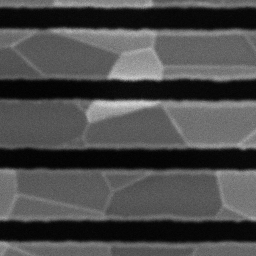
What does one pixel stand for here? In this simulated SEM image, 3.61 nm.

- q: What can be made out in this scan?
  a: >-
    lines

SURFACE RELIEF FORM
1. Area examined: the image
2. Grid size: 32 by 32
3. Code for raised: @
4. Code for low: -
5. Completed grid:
@@@@@@@@@@@@@@@@@@@@@@@@@@@@@@@@
--------------------------------
--------------------------------
--------------------------------
@@@@@@@@@@@@@@@@@@@@@@@@@@@@@@@@
@@@@@@@@@@@@@@@@@@@@@@@@@@@@@@@@
@@@@@@@@@@@@@@@@@@@@@@@@@@@@@@@@
@@@@@@@@@@@@@@@@@@@@@@@@@@@@@@@@
@@@@@@@@@@@@@@@@@@@@@@@@@@@@@@@@
@@@@@@@@@@@@@@@@@@@@@@@@@@@@@@@@
--------------------------------
--------------------------------
@@@--@@@@@@---------------------
@@@@@@@@@@@@@@@@@@@@@@@@@@@@@@@@
@@@@@@@@@@@@@@@@@@@@@@@@@@@@@@@@
@@@@@@@@@@@@@@@@@@@@@@@@@@@@@@@@
@@@@@@@@@@@@@@@@@@@@@@@@@@@@@@@@
@@@@@@@@@@@@@@@@@@@@@@@@@@@@@@@@
@@@-@@@@@@@@@@@@@@@@@@@@@@@@@@@@
--------------------------------
--------------------------------
@@@@@@@@@@@@@@@@@@@@@@@@@@@@@@@@
@@@@@@@@@@@@@@@@@@@@@@@@@@@@@@@@
@@@@@@@@@@@@@@@@@@@@@@@@@@@@@@@@
@@@@@@@@@@@@@@@@@@@@@@@@@@@@@@@@
@@@@@@@@@@@@@@@@@@@@@@@@@@@@@@@@
@@@@@@@@@@@@@@@@@@@@@@@@@@@@@@@@
@-@@@@@--@@@@@@@@@@@-@@@@@@@@@@@
--------------------------------
--------------------------------
@@@@@@@@@@@@@@@@@@@@@@@@@@@@@@@@
@@@@@@@@@@@@@@@@@@@@@@@@@@@@@@@@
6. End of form